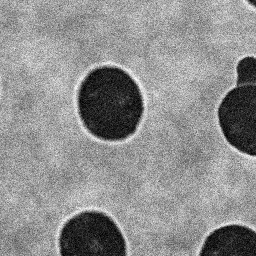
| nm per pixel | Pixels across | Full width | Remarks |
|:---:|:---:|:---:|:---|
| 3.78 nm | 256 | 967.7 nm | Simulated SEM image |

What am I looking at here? holes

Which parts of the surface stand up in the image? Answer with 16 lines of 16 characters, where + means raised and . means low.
++++++++++++++++
++++++++++++++++
++++++++++++++++
++++++++++++++++
++++++..+++++++.
+++++....++++++.
+++++....+++++..
+++++....+++++..
++++++..++++++..
+++++++++++++++.
++++++++++++++++
++++++++++++++++
++++++++++++++++
+++++..+++++++++
++++....+++++...
++++....+++++...